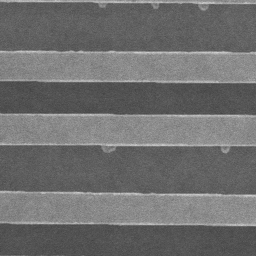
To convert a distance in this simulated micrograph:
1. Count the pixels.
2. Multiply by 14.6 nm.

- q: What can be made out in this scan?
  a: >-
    lines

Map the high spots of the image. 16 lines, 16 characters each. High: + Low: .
................
................
................
++++++++++++++++
++++++++++++++++
................
................
++++++++++++++++
++++++++++++++++
................
................
................
++++++++++++++++
++++++++++++++++
................
................